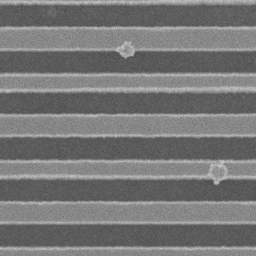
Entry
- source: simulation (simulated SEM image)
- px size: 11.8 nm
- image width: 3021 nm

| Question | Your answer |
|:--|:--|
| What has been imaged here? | lines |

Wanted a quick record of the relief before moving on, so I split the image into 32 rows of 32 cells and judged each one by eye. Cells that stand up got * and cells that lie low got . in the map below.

.........*......................
................................
................................
********************************
********************************
********************************
...............**...............
................................
................................
********************************
********************************
**********.....*.....*..........
................................
................................
********************************
********************************
********************************
................................
................................
................................
********************************
********************************
...........................*....
................................
................................
********************************
********************************
********************************
................................
................................
................................
********************************